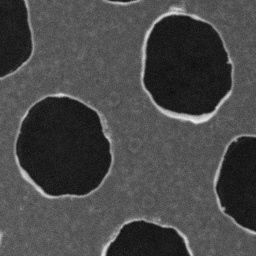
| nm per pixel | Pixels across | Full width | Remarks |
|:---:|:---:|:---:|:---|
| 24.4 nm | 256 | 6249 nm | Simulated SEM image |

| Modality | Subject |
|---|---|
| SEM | holes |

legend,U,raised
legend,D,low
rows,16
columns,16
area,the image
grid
DDUUUUUUUUUUUUUU
DDUUUUUUUUDDDUUU
DDUUUUUUUDDDDDUU
DDUUUUUUUDDDDDUU
DUUUUUUUUDDDDDUU
UUUUUUUUUDDDDDUU
UUDDDUUUUUDDDDUU
UDDDDDUUUUUUUUUU
UDDDDDDUUUUUUUUU
UDDDDDDUUUUUUUDD
UDDDDDDUUUUUUUDD
UUDDDDUUUUUUUDDD
UUUUUUUUUUUUUUDD
UUUUUUUUUUUUUUDD
UUUUUUUDDDDUUUUU
UUUUUUUDDDDDUUUU